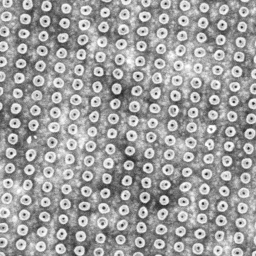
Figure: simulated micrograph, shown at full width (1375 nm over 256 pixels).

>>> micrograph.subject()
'a regular array of ring-shaped raised bodies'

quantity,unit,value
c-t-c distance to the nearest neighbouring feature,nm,78.9